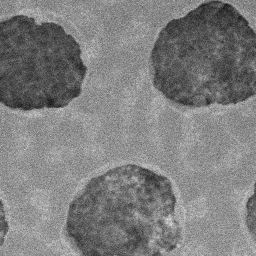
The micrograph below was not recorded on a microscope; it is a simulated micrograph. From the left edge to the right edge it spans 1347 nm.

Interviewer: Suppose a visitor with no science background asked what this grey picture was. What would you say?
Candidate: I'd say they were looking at holes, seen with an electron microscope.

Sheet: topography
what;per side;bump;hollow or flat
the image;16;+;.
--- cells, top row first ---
++++++++++++...+
...+++++++......
.....+++++......
.....++++.......
.....++++.......
.....+++++......
....+++++++..+++
++++++++++++++++
++++++++++++++++
++++++++++++++++
+++++++..+++++++
+++++......+++++
++++.......+++++
++++.......++++.
++++.......+++++
+++++......+++++